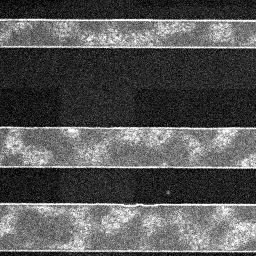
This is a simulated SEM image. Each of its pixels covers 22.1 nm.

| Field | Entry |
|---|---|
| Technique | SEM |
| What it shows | one or a few lines or trenches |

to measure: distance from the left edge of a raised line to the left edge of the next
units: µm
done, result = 2.15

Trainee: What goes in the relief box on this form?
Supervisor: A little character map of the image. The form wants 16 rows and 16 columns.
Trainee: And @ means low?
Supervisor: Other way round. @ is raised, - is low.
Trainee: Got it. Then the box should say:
----------------
@@@@@@@@@@@@@@@@
@@@@@@@@@@@@@@@@
----------------
----------------
----------------
----------------
----------------
@@@@@@@@@@@@@@@@
@@@@@@@@@@@@@@@@
----------------
----------------
----------------
@@@@@@@@@@@@@@@@
@@@@@@@@@@@@@@@@
@@@@@@@@@@@@@@@@